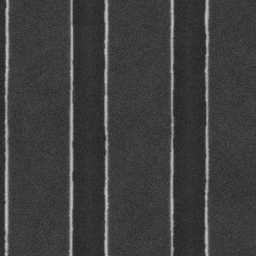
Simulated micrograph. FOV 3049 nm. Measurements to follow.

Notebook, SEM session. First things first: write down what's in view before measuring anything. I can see lines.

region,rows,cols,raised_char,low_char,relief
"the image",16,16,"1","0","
1111000111100111
1111000111100111
1111000111100111
1111000111100111
1111000111100111
1111000111100111
1111000111100111
1111000111100111
1111000111100111
1111000111100111
1111000111100111
1111000111100111
1111000111100111
1111000111100111
1111000111100111
1111000111100111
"